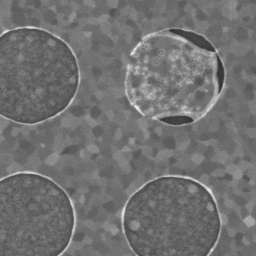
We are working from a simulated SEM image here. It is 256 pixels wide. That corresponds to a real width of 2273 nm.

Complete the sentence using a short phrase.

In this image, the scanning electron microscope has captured holes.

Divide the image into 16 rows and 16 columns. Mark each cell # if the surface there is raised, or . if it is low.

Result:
################
################
....########.###
.....###########
.....###########
.....###########
....############
#..########.####
################
################
################
...######...####
....####.....###
.....###......##
.....###......##
....####.....###